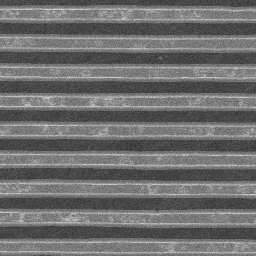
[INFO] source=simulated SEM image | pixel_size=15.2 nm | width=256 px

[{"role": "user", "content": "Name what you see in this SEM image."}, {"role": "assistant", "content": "parallel lines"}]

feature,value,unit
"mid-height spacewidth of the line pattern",0.243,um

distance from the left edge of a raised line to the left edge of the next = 442 nm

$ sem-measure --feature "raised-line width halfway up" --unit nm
203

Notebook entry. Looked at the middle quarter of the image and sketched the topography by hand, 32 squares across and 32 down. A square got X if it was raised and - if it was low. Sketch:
---------------X--X-------------
XXXXXXXXXXXXXXXXXXXXXXXXXXXXXXXX
XXXXXXXXXXXXXXXXXXXXXXXXXXXXXXXX
XXXXXXXXXXXXXXXXXXXXXXXXXXXXXXXX
--------------------------------
--------------------------------
--------------------------------
--------------------------------
XXXXXXXXXXXXXXXXXXXXXXXXXXXXXXXX
XXXXXXXXXXXXXXXXXXXXXXXXXXXXXXXX
XXXXXXXXXXXXXXXXXXXXXXXXXXXXXXXX
--------------------------------
--------------------------------
--------------------------------
--------------------------------
XXXXXXXXXXXXXXXXXXXXXXXXXXXXXXXX
XXXXXXXXXXXXXXXXXXXXXXXXXXXXXXXX
XXXXXXXXXXXXXXXXXXXXXXXXXXXXXXXX
--------------------------------
--------------------------------
--------------------------------
--------------------------------
XXXXXXXXXXXXXXXXX-----XXXXXXXXXX
XXXXXXXXXXXXXXXXXXXXXXXXXXXXXXXX
XXXXXXXXXXXXXXXXXXXXXXXXXXXXXXXX
-----------XXXXXXXXXXXXXXXXXXXXX
--------------------------------
--------------------------------
--------------------------------
--------------------------------
XXXXXXXXXXXXXXXXXXXXXXXXXXXXXXXX
XXXXXXXXXXXXXXXXXXXXXXXXXXXXXXXX